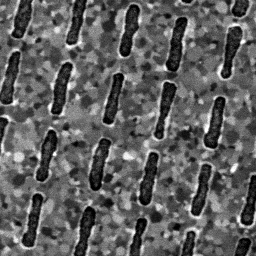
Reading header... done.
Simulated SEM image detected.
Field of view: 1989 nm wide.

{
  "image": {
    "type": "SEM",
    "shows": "a regular array of holes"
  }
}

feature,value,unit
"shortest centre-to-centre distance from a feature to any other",407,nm